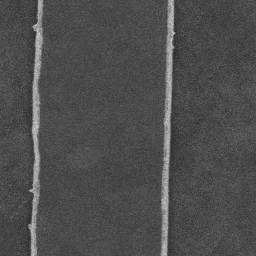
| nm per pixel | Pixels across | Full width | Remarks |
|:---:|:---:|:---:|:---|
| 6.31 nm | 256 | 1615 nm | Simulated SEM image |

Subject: one or a few lines or trenches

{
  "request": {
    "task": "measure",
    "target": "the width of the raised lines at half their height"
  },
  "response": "844 nm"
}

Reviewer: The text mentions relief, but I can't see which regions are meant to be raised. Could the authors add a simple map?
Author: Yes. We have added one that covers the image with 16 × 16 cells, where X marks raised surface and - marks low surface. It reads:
--XXXXXXXXX-----
--XXXXXXXXX-----
--XXXXXXXXX-----
--XXXXXXXXX-----
--XXXXXXXXX-----
--XXXXXXXXX-----
--XXXXXXXXX-----
--XXXXXXXXX-----
--XXXXXXXXX-----
--XXXXXXXX------
--XXXXXXXX------
--XXXXXXXX------
--XXXXXXXX------
--XXXXXXXX------
--XXXXXXXX------
--XXXXXXXX------